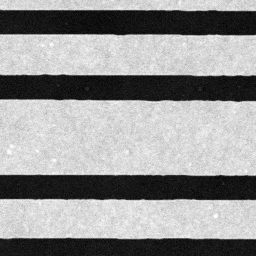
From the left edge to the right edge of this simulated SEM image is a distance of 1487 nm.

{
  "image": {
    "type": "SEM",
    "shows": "lines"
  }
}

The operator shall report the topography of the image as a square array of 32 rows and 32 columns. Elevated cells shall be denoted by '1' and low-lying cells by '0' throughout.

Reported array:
11111111111111111111111111111111
00000000000000000000000000000000
00000000000000000000000000000000
00000000000000000000000000000000
11111111111111111111111111111111
11111111111111111111111111111111
11111111111111111111111111111111
11111111111111111111111111111111
11111111111111111111111111111111
00000000000000000000000000000000
00000000000000000000000000000000
00000000000000000000000000000000
00000000000000000000000000000000
11111111111111111111111111111111
11111111111111111111111111111111
11111111111111111111111111111111
11111111111111111111111111111111
11111111111111111111111111111111
11111111111111111111111111111111
11111111111111111111111111111111
11111111111111111111111111111111
11111111111111111111111111111111
00000000000000000000000000000000
00000000000000000000000000000000
00000000000000000000000000000000
11111111111111111111111111111111
11111111111111111111111111111111
11111111111111111111111111111111
11111111111111111111111111111111
11111111111111111111111111111111
00000000000000000000000000000000
00000000000000000000000000000000